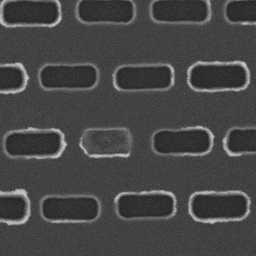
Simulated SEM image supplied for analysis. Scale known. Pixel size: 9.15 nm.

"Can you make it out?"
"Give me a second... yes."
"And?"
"a regular array of holes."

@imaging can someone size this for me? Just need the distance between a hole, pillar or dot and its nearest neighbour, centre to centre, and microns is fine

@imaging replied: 0.679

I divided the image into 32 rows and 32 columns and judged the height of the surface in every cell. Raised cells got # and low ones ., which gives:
#......###.......##.......##....
.......###.......##.......##....
#......###......####......###...
################################
################################
################################
################################
################################
..###.......###......###......##
...##.......###......###.......#
...##.......###......###.......#
################################
################################
################################
################################
################################
######.#############......###...
#.......###########.......##....
#......############.......###...
################################
################################
################################
################################
################################
###############......###......##
...##.......###.......##.......#
...##.......###.......##.......#
#.#####....#####################
################################
################################
################################
################################